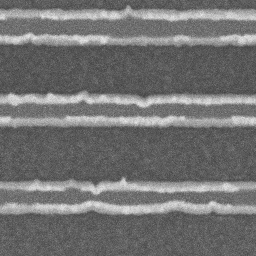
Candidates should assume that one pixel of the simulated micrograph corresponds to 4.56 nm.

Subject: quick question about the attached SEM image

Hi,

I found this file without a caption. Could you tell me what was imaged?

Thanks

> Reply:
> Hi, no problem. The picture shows one or a few lines or trenches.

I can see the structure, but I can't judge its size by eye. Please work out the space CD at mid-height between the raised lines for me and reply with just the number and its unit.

0.259 microns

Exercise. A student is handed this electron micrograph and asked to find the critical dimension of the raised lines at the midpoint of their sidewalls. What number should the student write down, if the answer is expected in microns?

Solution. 0.126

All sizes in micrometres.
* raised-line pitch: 0.387